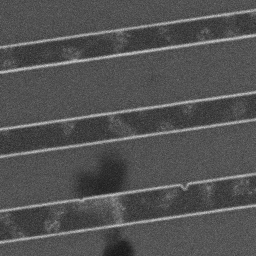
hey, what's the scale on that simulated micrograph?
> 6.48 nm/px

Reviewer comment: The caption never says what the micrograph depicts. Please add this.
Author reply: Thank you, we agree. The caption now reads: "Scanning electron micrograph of one or a few lines or trenches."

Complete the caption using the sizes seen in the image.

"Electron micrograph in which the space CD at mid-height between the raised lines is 354 nm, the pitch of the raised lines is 536 nanometres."